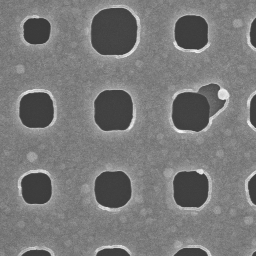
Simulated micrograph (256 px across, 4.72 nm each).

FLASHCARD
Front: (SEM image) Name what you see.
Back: a regular array of holes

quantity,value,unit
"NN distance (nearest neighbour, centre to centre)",364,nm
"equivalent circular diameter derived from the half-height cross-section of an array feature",177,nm